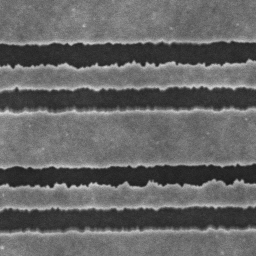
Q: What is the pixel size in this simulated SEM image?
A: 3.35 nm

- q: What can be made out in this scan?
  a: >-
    lines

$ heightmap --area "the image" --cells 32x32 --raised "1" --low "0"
11111111111111111111111111111111
11111111111111111111111111111111
11111111111111111111111111111111
11111111111111111111111111111111
11111111111111111111111111111111
01111100100100000000000000000000
00000000000000000000000000000000
00000000000000000000000000000000
11111111100111111111111111111111
11111111111111111111111111111111
11111111111111111111111111111111
00000000000000000000000000000000
00000000000000000000000000000000
00000000000000000000000000000001
11111111111111111111111111111111
11111111111111111111111111111111
11111111111111111111111111111111
11111111111111111111111111111111
11111111111111111111111111111111
11111111111111111111111111111111
11111111111111111111111111111111
00000000000000000000000000000000
00000000000000000000000000000000
11111111111111111111111111111111
11111111111111111111111111111111
11111111111111111111111111111111
00000000000000000000000000000000
00000000000000000000000000000000
00000000000000000000000000000000
11111111111111111111111111111111
11111111111111111111111111111111
11111111111111111111111111111111